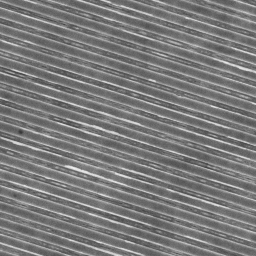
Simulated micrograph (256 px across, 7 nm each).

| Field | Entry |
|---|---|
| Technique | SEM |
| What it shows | parallel lines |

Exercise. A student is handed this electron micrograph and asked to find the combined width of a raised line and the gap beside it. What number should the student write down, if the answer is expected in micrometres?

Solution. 0.108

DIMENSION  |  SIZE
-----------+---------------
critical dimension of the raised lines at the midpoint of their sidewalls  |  10 px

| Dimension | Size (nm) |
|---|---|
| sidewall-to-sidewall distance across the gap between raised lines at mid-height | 40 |